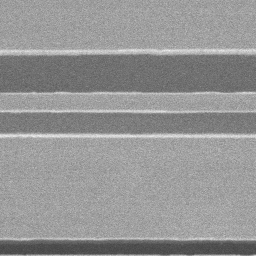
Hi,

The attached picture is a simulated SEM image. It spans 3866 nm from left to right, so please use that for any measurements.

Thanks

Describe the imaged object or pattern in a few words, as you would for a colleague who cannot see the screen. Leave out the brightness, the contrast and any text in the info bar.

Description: lines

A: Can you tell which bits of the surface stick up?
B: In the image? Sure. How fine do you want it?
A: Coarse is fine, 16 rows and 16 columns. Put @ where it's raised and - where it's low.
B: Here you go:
@@@@@@@@@@@@@@@@
@@@@@@@@@@@@@@@@
@@@@@@@@@@@@@@@@
----------------
----------------
----------------
@@@@@@@@@@@@@@@@
@@@@@@@@@@@@@@@@
@@@@@@@@@@@@@@@@
@@@@@@@@@@@@@@@@
@@@@@@@@@@@@@@@@
@@@@@@@@@@@@@@@@
@@@@@@@@@@@@@@@@
@@@@@@@@@@@@@@@@
@@@@@@@@@@@@@@@@
----------------